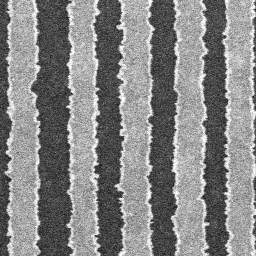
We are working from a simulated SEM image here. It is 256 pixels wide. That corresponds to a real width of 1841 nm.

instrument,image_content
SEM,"parallel lines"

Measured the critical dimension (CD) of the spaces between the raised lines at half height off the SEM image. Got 0.191 microns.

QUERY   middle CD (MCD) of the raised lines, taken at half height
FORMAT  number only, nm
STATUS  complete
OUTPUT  190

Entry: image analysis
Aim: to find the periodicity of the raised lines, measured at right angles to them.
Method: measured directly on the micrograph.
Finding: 54.2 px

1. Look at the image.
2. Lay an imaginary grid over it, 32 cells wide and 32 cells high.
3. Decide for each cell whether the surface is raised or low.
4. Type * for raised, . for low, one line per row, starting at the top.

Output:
.***.....***...****...***...****
.***.....***...****...***...****
.***.....***...***....****..****
.****....***...****...****..****
.***.....***....***...***...****
.***.....***...****...***...****
.****....***...****...****..****
.****....***...****...***...****
.****....***...****...***...****
.****....***...****...***...****
.***.....***...****...***...****
.***.....***...****...***...****
.***.....***...****...***....**.
.***.....***...****...****..****
.****....***...****...****..****
..***...****...****...***...****
.****....***...****...****..****
.****....***....***...****...***
.****....***...****...***...****
.****....***...***....***...****
.****....***...****...****..****
.****....***...****...***....***
.****....***...***....***...****
.****....***...****...***....***
.****....***...****...***...****
.****....***...****...****..****
.****....***...****...****..****
.****....***...****...***...****
.****....***...****...***...****
.****....***....***...****...***
.****....***...****...****..****
.****....***...****...***....***